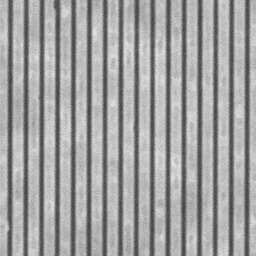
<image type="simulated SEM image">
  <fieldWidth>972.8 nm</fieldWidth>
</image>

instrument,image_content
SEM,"parallel lines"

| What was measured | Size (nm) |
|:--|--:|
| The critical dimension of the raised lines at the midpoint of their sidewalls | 40.9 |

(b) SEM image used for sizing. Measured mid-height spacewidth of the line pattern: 0.0204 µm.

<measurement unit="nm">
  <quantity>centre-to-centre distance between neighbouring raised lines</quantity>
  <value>60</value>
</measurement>